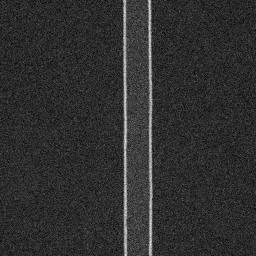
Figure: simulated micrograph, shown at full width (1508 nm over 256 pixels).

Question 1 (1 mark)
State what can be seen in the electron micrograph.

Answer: one or a few lines or trenches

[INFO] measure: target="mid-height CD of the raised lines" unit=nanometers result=150